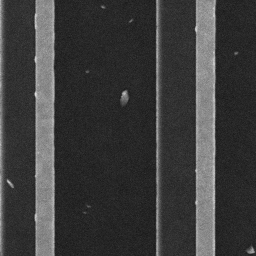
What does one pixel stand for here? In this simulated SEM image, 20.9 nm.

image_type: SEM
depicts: lines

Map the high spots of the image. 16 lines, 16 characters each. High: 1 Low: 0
1110000000111000
1110000000111000
1110000000111000
1110000000111000
1110000000111000
1110000000111000
1110000000111000
1110000000111000
1110000000111000
1110000000111000
1110000000111000
1110000000111000
1110000000111000
1110000000111000
1110000000111000
1110000000111000